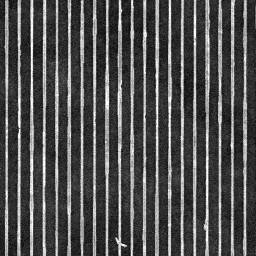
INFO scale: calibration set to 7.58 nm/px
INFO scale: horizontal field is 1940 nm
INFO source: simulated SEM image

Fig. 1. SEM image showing parallel lines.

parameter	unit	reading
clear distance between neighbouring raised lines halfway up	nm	78.6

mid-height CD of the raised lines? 14.2 nanometres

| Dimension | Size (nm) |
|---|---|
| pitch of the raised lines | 95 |